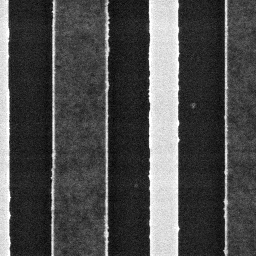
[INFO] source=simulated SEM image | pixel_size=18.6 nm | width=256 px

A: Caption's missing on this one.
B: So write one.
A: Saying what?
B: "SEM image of lines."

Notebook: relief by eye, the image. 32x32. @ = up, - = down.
@------@@@@@@------@@@------@@@@
@------@@@@@@------@@@------@@@@
@------@@@@@@------@@@------@@@@
@------@@@@@@------@@@------@@@@
@------@@@@@@------@@@------@@@@
@------@@@@@@------@@@------@@@@
@------@@@@@@------@@@------@@@@
@------@@@@@@------@@@------@@@@
@------@@@@@@------@@@------@@@@
@------@@@@@@------@@@------@@@@
@------@@@@@@------@@@------@@@@
@------@@@@@@------@@@------@@@@
@------@@@@@@------@@@------@@@@
@------@@@@@@------@@@------@@@@
@------@@@@@@------@@@------@@@@
@------@@@@@@------@@@------@@@@
@------@@@@@@------@@@------@@@@
@------@@@@@@------@@@------@@@@
@------@@@@@@------@@@------@@@@
@------@@@@@@------@@@------@@@@
@------@@@@@@------@@@------@@@@
@------@@@@@@------@@@------@@@@
@------@@@@@@------@@@------@@@@
@------@@@@@@------@@@------@@@@
@------@@@@@@------@@@------@@@@
@------@@@@@@------@@@------@@@@
@------@@@@@@------@@@------@@@@
@------@@@@@@------@@@------@@@@
@------@@@@@@------@@@------@@@@
@------@@@@@@------@@@------@@@@
@------@@@@@@------@@@------@@@@
@------@@@@@@------@@@------@@@@